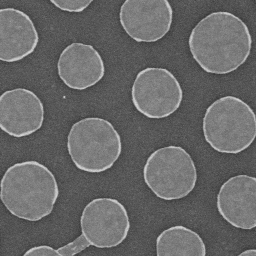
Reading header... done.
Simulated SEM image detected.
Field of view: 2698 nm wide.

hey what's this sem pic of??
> raised bodies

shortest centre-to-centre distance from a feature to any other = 0.845 µm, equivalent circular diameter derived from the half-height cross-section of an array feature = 50.1 pixels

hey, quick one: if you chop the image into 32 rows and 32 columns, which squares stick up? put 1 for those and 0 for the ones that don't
00000001111000011111100000000000
11000000000000011111100000000000
11110000000000011111100001111100
11110000000000001111100011111110
11111000000000001111000011111110
11110000010000000000000011111110
11110000111100000000000011111110
11000001111110000000000001111100
00000001111110000000000001111000
00000000111110000111100000000000
00000000111100000111110000000000
01110000000000000111111000000000
11111000000000000111111000011100
11111000000000000111110000111110
11111000000000000001100000111111
11111000011111000000000001111111
01110000011111000000000000111111
00000000011111100000000000111111
00000000011111100000110000011100
00000000011111100001111100000000
00010000001111000011111100000000
01111100000000000011111100000000
11111110000000000011111100000111
11111110000000000001111100001111
11111110000000000000111000011111
01111110000111100000000000011111
01111100001111110000000000001111
00001000001111110000000000001111
00000000001111110000001000000010
00000000000111110000111110000000
00000000000011100000111110000000
00001110000000000000111111000001